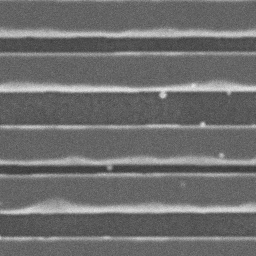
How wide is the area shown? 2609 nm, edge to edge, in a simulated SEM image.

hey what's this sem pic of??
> lines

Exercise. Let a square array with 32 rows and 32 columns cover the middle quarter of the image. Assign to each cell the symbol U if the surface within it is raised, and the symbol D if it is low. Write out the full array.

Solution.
UUUUUUUUUUUUUUUUUUUUUUUUUUUUUUUU
UUUUUUUUUUUUUUUUUUUUUUUUUUUUUUUU
UUUUUUUUUUUUUUUUUUUUUUUUUUUUUUUU
UUUUUUUUUUUUUUUUUUUUUUUUUUUUUUUU
UUUUUUUUUUUUUUUUUUUUUUUUUUUUUUUU
UUUUUUUUUUUUUUUUUUUUUUUUUUUUUUUU
DDDDDDDDDDDDDDDUUUUUUDDDDDDDDDDD
DDDDDDDDDDDDDDDDDDDDDDDDDDDDDDDD
DDDDDDDDDDDDDDDDDDDDDDDDDDDDDDDD
DDDDDDDDDDDDDDDDDDDDDDDDDDDDDDDD
DDDDDDDDDDDDDDDDDDDDDDDDDDDDDDDD
DDDDDDDDDDDDDDDDDDDDDDDDDDDDDDDD
DDDDDDDDDDDDDDDDDDDDDDDDDDDDDDDD
DDDDDDDDDDDDDDDDDDDDDDDDDDDDDDDD
DDDDDDDDDDDDDDDDDDDDDDDDDDDDDDDD
DDDDDDDDDDDDDDDDDDDDDDUUUUUUUDDD
UUUUUUUUUUUUUUUUUUUUUUUUUUUUUUUU
UUUUUUUUUUUUUUUUUUUUUUUUUUUUUUUU
UUUUUUUUUUUUUUUUUUUUUUUUUUUUUUUU
UUUUUUUUUUUUUUUUUUUUUUUUUUUUUUUU
UUUUUUUUUUUUUUUUUUUUUUUUUUUUUUUU
UUUUUUUUUUUUUUUUUUUUUUUUUUUUUUUU
UUUUUUUUUUUUUUUUUUUUUUUUUUUUUUUU
UUUUUUUUUUUUUUUUUUUUUUUUUUUUUUUU
UUUUUUUUUUUUUUUUUUUUUUUUUUUUUUUU
DDDDDDDDDDDDDDDDDDDDDDDDDDDDDDDD
DDDDDDDDDDDDDDDDDDDDDDDDDDDDDDDD
DDDDDDDDUUUUDDUUUUUDDDUUUUUUUUUU
UUUUUUUUUUUUUUUUUUUUUUUUUUUUUUUU
UUUUUUUUUUUUUUUUUUUUUUUUUUUUUUUU
UUUUUUUUUUUUUUUUUUUUUUUUUUUUUUUU
UUUUUUUUUUUUUUUUUUUUUUUUUUUUUUUU